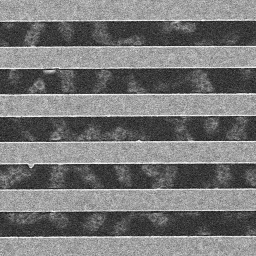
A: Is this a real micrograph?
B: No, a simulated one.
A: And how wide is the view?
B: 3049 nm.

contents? parallel lines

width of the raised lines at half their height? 250 nanometers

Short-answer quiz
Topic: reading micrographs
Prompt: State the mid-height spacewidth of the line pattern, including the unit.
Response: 26.3 px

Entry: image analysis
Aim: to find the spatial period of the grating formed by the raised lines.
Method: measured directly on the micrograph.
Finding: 567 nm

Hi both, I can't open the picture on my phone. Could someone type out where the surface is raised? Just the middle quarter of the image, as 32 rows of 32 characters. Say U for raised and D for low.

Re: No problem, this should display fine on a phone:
UUUUUUUUUUUUUUUUUUUUUUUUUUUUUUUU
DDDDDDDDDDDDDDDDDDDDDDDDDDDDDDDD
DDDDDDDDDDUDDDDDDDDDDDDDDDDDDDDD
DDDDDDDDDDDDDDDDDDDDDDDDDDDDDDDD
DDDDDDDDDDDDDDDDDDDDDDDDDDDDDDDD
DDDDDDDDDDDDDDDDDDDDDDDDDDDDDDDD
DDDDDDDDDDDDDDDDDDDDDDDDDDDDDDDD
DDDDDDDDDDDDDDDDDDDDDDDDDDDDDDDD
UUUUUUUUUUUUUUUUUUUUUUUUUUUUUUUU
UUUUUUUUUUUUUUUUUUUUUUUUUUUUUUUU
UUUUUUUUUUUUUUUUUUUUUUUUUUUUUUUU
UUUUUUUUUUUUUUUUUUUUUUUUUUUUUUUU
UUUUUUUUUUUUUUUUUUUUUUUUUUUUUUUU
DDDDDDDDDDDDDDDDDDDDDDDDDDDDDDDD
DDDDDDDDDDDDDDDDDDDDDDDDDDDDDDDD
DDDDDDDDDDDDDDDDDDDDDDDDDDDDDDDD
DDDDDDDDDDDDDDDDDDDDDDDDDDDDDDDD
DDDDDDDDDDDDDDDDDDDDDDDDDDDDDDDD
DDDDDDDDDDDDDDDDDDDDDDDDDDDDDDDD
DDDDDDDDDDDDDDDDUUUUUUUUUUUUUUUD
UUUUUUUUUUUUUUUUUUUUUUUUUUUUUUUU
UUUUUUUUUUUUUUUUUUUUUUUUUUUUUUUU
UUUUUUUUUUUUUUUUUUUUUUUUUUUUUUUU
UUUUUUUUUUUUUUUUUUUUUUUUUUUUUUUU
UUUUUUUUUUUUUUUUUUUUUUUUUUUUUUUU
DDDDDDDDDDDDDDDDDDDDDDDDDDDDDDDD
DDDDDDDDDDDDDDDDDDDDDDDDDDDDDDDD
DDDDDDDDDDDDDDDDDDDDDDDDDDDDDDDD
DDDDDDDDDDDDDDDDDDDDDDDDDDDDDDDD
DDDDDDDDDDDDDDDDDDDDDDDDDDDDDDDD
DDDDDDDDDDDDDDDDDDDDDDDDDDDDDDDD
DDDDDDDDDDDDDDDDDDDUUUUUUUUUUUUU